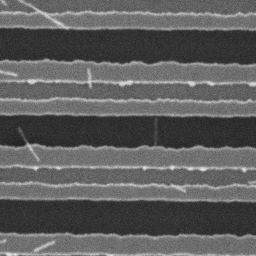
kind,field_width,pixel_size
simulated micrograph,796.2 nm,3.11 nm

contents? lines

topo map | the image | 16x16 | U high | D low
UUUUUUUUUUUUUUUU
UUUUUUUUUUUUUUUU
DDDDDDDDDDDDDDDD
DDDDDDDDDDDDDDDD
UUUUUUUUUUUUUUUU
UUUUUUUUUUUUUUUU
UUUUUUUUUUUUUUUU
DDDDDDDDDDDDDDDD
DDDDDDDDDDDDDDDD
UUUUUUUUUUUUUUUU
UUUUUUUUUUUUUUUU
UUUUUUUUUUUUUUUU
DDDDDUUUUUUUUUUU
DDDDDDDDDDDDDDDD
DDDDDDDDDDDDDDDD
UUUUUUUUUUUUUUUU